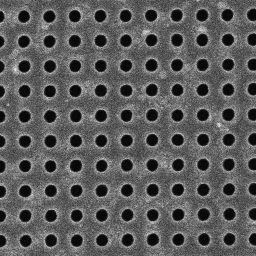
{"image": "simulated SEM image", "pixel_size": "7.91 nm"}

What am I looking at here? a regular array of holes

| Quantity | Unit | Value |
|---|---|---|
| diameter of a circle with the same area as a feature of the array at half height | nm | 88.4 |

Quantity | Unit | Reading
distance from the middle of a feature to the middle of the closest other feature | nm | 196